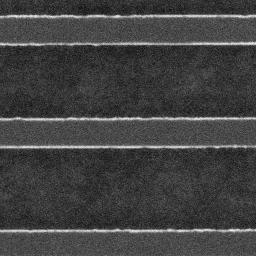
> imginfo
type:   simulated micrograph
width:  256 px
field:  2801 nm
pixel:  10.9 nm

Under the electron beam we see lines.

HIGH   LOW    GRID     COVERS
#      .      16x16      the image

................
################
################
................
................
................
................
################
################
................
................
................
................
................
################
################